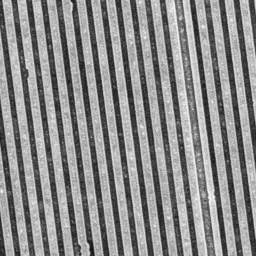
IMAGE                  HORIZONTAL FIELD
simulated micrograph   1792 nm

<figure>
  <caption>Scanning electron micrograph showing parallel lines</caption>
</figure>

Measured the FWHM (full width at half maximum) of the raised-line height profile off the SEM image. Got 0.0582 µm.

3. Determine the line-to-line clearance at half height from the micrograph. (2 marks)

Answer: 45.1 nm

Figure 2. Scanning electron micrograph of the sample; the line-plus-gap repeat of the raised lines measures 103 nm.